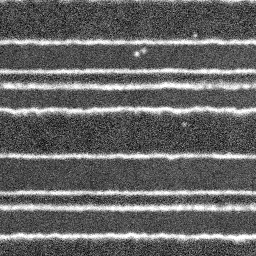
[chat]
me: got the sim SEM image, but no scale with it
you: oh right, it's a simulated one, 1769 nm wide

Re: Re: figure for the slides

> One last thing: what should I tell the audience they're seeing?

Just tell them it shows lines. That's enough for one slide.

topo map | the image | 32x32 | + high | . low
++++++++++++++++++++++++++++++++
++++++++++++++++++++++++++++++++
++++++++++++++++++++++++++++++++
++++++++++++++++++++++++++++++++
++++++++++++++++++++++++++++++++
................................
................................
................................
................................
++++++++++++++++++++++++++++++++
++++++++++++++++++++++++++++++++
................................
................................
................................
++++++++++++++++++++++++++++++++
++++++++++++++++++++++++++++++++
++++++++++++++++++++++++++++++++
++++++++++++++++++++++++++++++++
++++++++++++++++++++++++++++++++
++++++++++++++++++++++++++++++++
................................
................................
................................
................................
++++++++++++++++++++++++++++++++
++++++++++++++++++++++++++++++++
................................
................................
................................
..+++++++.+.+++.++++++...+......
++++++++++++++++++++++++++++++++
++++++++++++++++++++++++++++++++